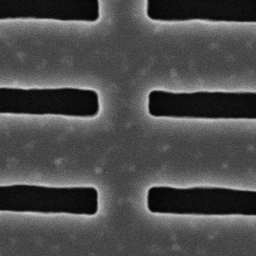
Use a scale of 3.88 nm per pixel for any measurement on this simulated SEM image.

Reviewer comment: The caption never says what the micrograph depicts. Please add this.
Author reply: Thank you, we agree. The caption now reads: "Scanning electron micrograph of holes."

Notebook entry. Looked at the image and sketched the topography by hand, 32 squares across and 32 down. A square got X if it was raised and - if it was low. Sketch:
------------XXXXXX--------------
------------XXXXXX--------------
XXXXXXXX----XXXXXXXXX---X-------
XXXXXXXXXXXXXXXXXXXXXXXXXXXXXXXX
XXXXXXXXXXXXXXXXXXXXXXXXXXXXXXXX
XXXXXXXXXXXXXXXXXXXXXXXXXXXXXXXX
XXXXXXXXXXXXXXXXXXXXXXXXXXXXXXXX
XXXXXXXXXXXXXXXXXXXXXXXXXXXXXXXX
XXXXXXXXXXXXXXXXXXXXXXXXXXXXXXXX
XXXXXXXXXXXXXXXXXXXXXXXXXXXXXXXX
XXXXXXXXXXXXXXXXXXXXXXXXXXXXXXXX
------------XXXXXXX--XXX--XXXX-X
------------XXXXXXX-------------
------------XXXXXXX-------------
XXXXXXXXX---XXXXXXX-------------
XXXXXXXXXXXXXXXXXXXXXXXXXXXXXXXX
XXXXXXXXXXXXXXXXXXXXXXXXXXXXXXXX
XXXXXXXXXXXXXXXXXXXXXXXXXXXXXXXX
XXXXXXXXXXXXXXXXXXXXXXXXXXXXXXXX
XXXXXXXXXXXXXXXXXXXXXXXXXXXXXXXX
XXXXXXXXXXXXXXXXXXXXXXXXXXXXXXXX
XXXXXXXXXXXXXXXXXXXXXXXXXXXXXXXX
XXXXXXXXXXXXXXXXXXXXXXXXXXXXXXXX
-----------XXXXXXXX--------XXXXX
------------XXXXXX--------------
------------XXXXXX--------------
XX-XX-------XXXXXXX-------------
XXXXXXXXXXXXXXXXXXXXXXXXXXXXXXXX
XXXXXXXXXXXXXXXXXXXXXXXXXXXXXXXX
XXXXXXXXXXXXXXXXXXXXXXXXXXXXXXXX
XXXXXXXXXXXXXXXXXXXXXXXXXXXXXXXX
XXXXXXXXXXXXXXXXXXXXXXXXXXXXXXXX